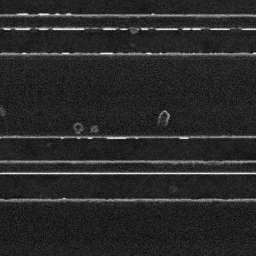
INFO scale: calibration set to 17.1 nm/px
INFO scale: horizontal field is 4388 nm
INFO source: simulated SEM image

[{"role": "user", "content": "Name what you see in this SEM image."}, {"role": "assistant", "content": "lines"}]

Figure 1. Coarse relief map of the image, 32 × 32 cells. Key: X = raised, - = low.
--------------------------------
--------------------------------
XXXXXXXXXXXXXXXXXXXXXXXXXXXXXXXX
XXXXXXXXXXXXXXXXXXXXXXXXXXXXXXXX
--------------------------------
--------------------------------
--------------------------------
XXXXXXXXXXXXXXXXXXXXXXXXXXXXXXXX
XXXXXXXXXXXXXXXXXXXXXXXXXXXXXXXX
XXXXXXXXXXXXXXXXXXXXXXXXXXXXXXXX
XXXXXXXXXXXXXXXXXXXXXXXXXXXXXXXX
XXXXXXXXXXXXXXXXXXXXXXXXXXXXXXXX
XXXXXXXXXXXXXXXXXXXXXXXXXXXXXXXX
XXXXXXXXXXXXXXXXXXXXXXXXXXXXXXXX
XXXXXXXXXXXXXXXXXXXXXXXXXXXXXXXX
XXXXXXXXXXXXXXXXXXXXXXXXXXXXXXXX
XXXXXXXXXXXXXXXXXXXXXXXXXXXXXXXX
--------------------------------
--------------------------------
--------------------------------
XXXXXXXXXXXXXXXXXXXXXXXXXXXXXXXX
XXXXXXXXXXXXXXXXXXXXXXXXXXXXXXXX
--------------------------------
--------------------------------
--------------------------------
XXXXXXXXXXXXXXXXXXXXXXXXXXXXXXXX
XXXXXXXXXXXXXXXXXXXXXXXXXXXXXXXX
XXXXXXXXXXXXXXXXXXXXXXXXXXXXXXXX
XXXXXXXXXXXXXXXXXXXXXXXXXXXXXXXX
XXXXXXXXXXXXXXXXXXXXXXXXXXXXXXXX
XXXXXXXXXXXXXXXXXXXXXXXXXXXXXXXX
XXXXXXXXXXXXXXXXXXXXXXXXXXXXXXXX